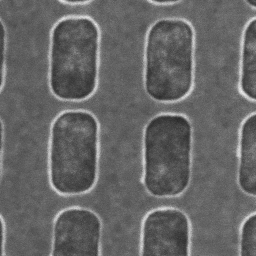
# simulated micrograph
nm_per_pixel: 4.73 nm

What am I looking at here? holes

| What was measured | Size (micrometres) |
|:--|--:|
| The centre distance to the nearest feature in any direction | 0.444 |